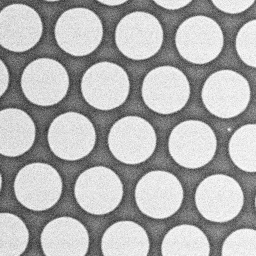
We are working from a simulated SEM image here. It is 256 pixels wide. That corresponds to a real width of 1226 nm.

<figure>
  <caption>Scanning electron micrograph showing an array of small figures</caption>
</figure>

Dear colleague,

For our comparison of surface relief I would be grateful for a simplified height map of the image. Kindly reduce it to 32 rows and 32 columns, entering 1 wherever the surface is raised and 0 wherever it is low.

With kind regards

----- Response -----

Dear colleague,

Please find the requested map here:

00000000000001100000111000011110
11110000111000000000000000001100
11111001111100011111000111100000
11111001111110011111001111100011
11111001111110011111001111110011
11110001111100011111001111110011
00000000111000011111001111100011
00000100000000000000000111000011
10011111000111100000110000000000
10011111001111110011111000111100
10011111101111110011111100111110
00011111001111110011111101111110
00001110000111110011111001111110
00000000000011000001111000111110
11100001110000000000000000011000
11110011111000111110000111000000
11110011111100111110001111100011
11110011111100111110011111100111
11110011111100111110011111100111
00000001111000111110001111100111
00001000000000000000001111000011
00111110000111000001100000000000
00111111001111100011110000111000
00111111011111100111111001111100
00111110011111100111111011111100
00011110001111100111111001111100
00000000000111000011110001111100
11100001100000000000000000111000
11100011111000111100001110000000
11100111111001111100011111000111
11100111111001111110111111001111
11100011111001111100111111001111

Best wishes